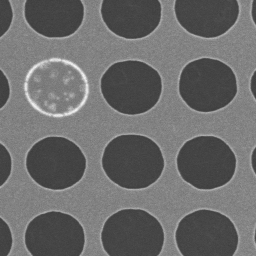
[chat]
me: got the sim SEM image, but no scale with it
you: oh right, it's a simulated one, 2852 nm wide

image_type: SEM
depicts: holes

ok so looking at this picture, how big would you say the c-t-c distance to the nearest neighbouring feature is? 0.831 um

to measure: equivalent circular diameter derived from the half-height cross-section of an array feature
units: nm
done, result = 630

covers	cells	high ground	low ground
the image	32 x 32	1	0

01100000001110000000110000000011
00100000001110000000110000000010
00100000001110000000110000000011
01110000001111000001111000000111
11111100111111100011111110011111
11111111111111111111111111111111
11111111111111111111111111111111
11111111111111110111111100011111
11111111111111000001111000000111
01111111111110000000111000000111
01111111111110000000110000000010
01111111111110000000110000000011
01111111111110000000111000000111
11111111111111000001111100001111
11111111111111111111111111111111
11111111111111111111111111111111
11111111111111111111111111111111
11111000011111000001111100001111
01110000001110000000111000000111
01100000000110000000110000000110
01100000000110000000010000000010
01110000000110000000110000000111
01110000001111000000111000000111
11111100111111100011111110011111
11111111111111111111111111111111
11111111111111111111111111111111
11111101111111100011111100011111
11110000001110000000111000000111
01100000001110000000110000000111
01100000000110000000110000000011
00100000001110000000110000000011
01110000001110000000111000000111